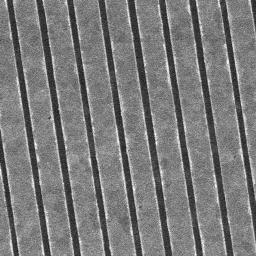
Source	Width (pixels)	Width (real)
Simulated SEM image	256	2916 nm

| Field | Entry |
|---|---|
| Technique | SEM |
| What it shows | parallel lines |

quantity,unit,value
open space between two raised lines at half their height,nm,80.3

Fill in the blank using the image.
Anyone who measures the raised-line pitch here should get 344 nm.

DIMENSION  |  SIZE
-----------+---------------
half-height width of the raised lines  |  0.267 microns